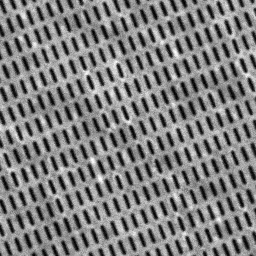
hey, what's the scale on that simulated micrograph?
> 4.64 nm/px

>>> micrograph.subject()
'a regular array of holes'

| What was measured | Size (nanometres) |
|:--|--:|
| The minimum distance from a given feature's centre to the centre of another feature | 48.9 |